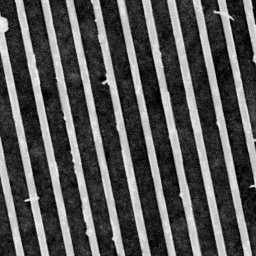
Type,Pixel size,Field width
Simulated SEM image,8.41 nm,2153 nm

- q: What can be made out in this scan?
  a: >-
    parallel lines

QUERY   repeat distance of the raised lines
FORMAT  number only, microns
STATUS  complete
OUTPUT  0.209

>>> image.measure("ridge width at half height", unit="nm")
60.8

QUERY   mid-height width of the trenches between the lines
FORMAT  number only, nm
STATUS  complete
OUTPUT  145